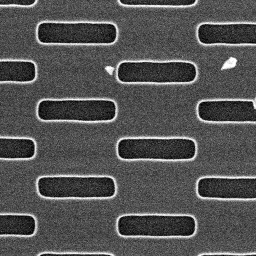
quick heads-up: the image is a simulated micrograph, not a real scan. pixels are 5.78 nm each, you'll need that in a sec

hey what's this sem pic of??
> groups of lines, slits or small figures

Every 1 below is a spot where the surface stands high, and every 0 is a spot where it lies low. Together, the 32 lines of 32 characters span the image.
00001111111111100000000011111111
11111111111111111111111111111111
11111111111111111111111111111111
11111000000000111111111110000000
11111000000000011111111110000000
11111100000001111111111111000000
11111111111111111111111111111111
11111111111111111111111111111111
00001111111111100000000011111111
00001111111111100000000011111111
11111111111111111111111111111111
11111111111111111111111111111111
11111100000001111111111111111111
11111000000000011111111110000000
11111000000000111111111110000000
11111111111111111111111111111111
11111111111111111111111111111111
00001111111111100000000011111111
00001111111111100000000011111111
00001111111111100000000011111111
11111111111111111111111111111111
11111111111111111111111111111111
11111000000000111111111110000000
11111000000000111111111110000000
11111000000000111111111110000000
11111111111111111111111111111111
11111111111111111111111111111111
00001111111111100000000011111111
00001111111111100000000011111111
11111111111111110000000111111111
11111111111111111111111111111111
11111111111111111111111111111111